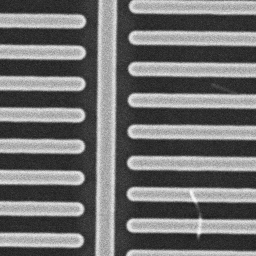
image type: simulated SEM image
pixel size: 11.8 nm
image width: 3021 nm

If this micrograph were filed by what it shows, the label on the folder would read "groups of lines, slits or small figures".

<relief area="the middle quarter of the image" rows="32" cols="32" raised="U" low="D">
DDDDDDDDDUUUUDDDUUUUUUUUUUUUUUUU
DDDDDDDDDUUUUDDDUUUUUUUUUUUUUUUU
DDDDDDDDDUUUUDDDDUUUUUUUUUUUUUUU
UUUUDDDDDUUUUDDDDDDDDDDDDDDDDDDD
UUUUUDDDDUUUUDDDDDDDDDDDDDDDDDDD
UUUUUDDDDUUUUDDDDDDDDDDDDDDDDDDD
DDDDDDDDDUUUUDDDDDDDDDDDDDDDDDDD
DDDDDDDDDUUUUDDDDUUUDDDDDDDDDDDD
DDDDDDDDDUUUUDDDUUUUUUUUUUUUUUUU
DDDDDDDDDUUUUDDDUUUUUUUUUUUUUUUU
DDDDDDDDDUUUUDDDDUUUUUUUUUUUUUUU
UUUUUDDDDUUUUDDDDDDDDDDDDDDDDDDD
UUUUUDDDDUUUUDDDDDDDDDDDDDDDDDDD
UUUUUDDDDUUUUDDDDDDDDDDDDDDDDDDD
DDDDDDDDDUUUUDDDDDDDDDDDDDDDDDDD
DDDDDDDDDUUUUDDDDUUUUUUUUUDDDDDD
DDDDDDDDDUUUUDDDUUUUUUUUUUUUUUUU
DDDDDDDDDUUUUDDDUUUUUUUUUUUUUUUU
DDDDDDDDDUUUUDDDDDDDDUUUUUUUUUUU
UUUUUDDDDUUUUDDDDDDDDDDDDDDDDDDD
UUUUUDDDDUUUUDDDDDDDDDDDDDDDDDDD
UUUUUDDDUUUUUDDDDDDDDDDDDDDDDDDD
DDDDDDDDUUUUUDDDDDDDDDDDDDDDDDDD
DDDDDDDDUUUUUDDDUUUUUUUUUUUUUUUU
DDDDDDDDUUUUUDDDUUUUUUUUUUUUUUUU
DDDDDDDDUUUUUDDDUUUUUUUUUUUUUUUU
DDDDDDDDUUUUUDDDDDDDDDDDDDDDUUUU
UUUUUDDDUUUUUDDDDDDDDDDDDDDDDDDD
UUUUUDDDUUUUUDDDDDDDDDDDDDDDDDDD
UUUUUDDDUUUUUDDDDDDDDDDDDDDDDDDD
DDDDDDDDUUUUUDDDDDDDDDDDDDDDDDDD
DDDDDDDDUUUUUDDDUUUUUUUUUUUUUUUU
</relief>